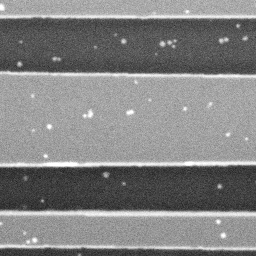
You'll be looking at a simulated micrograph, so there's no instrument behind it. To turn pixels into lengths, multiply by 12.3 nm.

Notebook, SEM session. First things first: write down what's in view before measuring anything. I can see lines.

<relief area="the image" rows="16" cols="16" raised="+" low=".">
++++++++++++++++
................
................
................
................
++++++++++++++++
++++++++++++++++
++++++++++++++++
++++++++++++++++
++++++++++++++++
................
................
................
++++++++++++++++
++++++++++++++++
...........+++++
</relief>